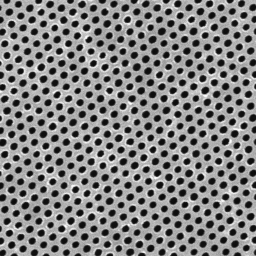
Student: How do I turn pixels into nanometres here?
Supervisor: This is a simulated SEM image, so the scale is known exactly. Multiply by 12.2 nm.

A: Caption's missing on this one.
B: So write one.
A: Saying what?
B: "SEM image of a regular array of holes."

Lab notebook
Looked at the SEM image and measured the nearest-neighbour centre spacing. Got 145 nanometres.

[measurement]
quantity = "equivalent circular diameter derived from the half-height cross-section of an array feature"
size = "7.4 pixels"